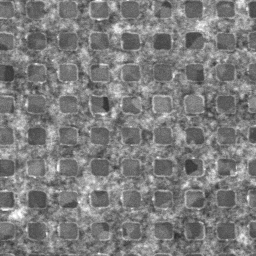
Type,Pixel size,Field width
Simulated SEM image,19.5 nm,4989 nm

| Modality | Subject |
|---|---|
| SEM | a regular array of raised bodies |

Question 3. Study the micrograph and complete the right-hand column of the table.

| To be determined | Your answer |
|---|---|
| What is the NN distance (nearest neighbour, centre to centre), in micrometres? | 0.607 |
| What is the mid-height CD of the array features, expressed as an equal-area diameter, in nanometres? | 401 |